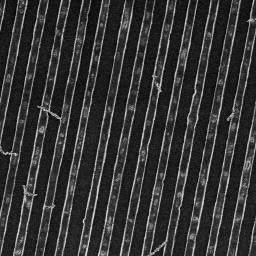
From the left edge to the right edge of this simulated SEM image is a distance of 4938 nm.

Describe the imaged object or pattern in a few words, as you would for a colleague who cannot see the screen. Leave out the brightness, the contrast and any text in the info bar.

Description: parallel lines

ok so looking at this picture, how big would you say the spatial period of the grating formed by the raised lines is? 404 nanometres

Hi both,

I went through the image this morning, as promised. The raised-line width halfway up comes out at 8.23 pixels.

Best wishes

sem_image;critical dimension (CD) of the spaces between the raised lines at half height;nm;249